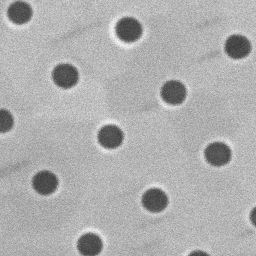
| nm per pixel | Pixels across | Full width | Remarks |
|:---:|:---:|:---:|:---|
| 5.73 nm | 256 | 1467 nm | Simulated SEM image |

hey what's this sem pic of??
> a regular array of holes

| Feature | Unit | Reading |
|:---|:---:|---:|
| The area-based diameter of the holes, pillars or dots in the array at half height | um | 0.158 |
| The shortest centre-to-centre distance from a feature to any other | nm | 439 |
